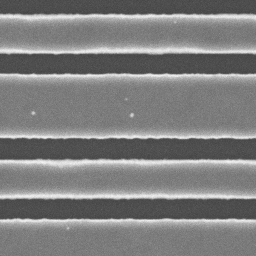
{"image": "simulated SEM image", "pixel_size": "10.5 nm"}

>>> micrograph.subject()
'lines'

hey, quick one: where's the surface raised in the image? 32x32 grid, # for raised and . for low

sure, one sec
................................
................................
################################
################################
################################
################################
################################
................................
................................
################################
################################
################################
################################
################################
################################
################################
################################
................................
................................
................................
################################
################################
################################
################################
################################
................................
................................
################################
################################
################################
################################
################################